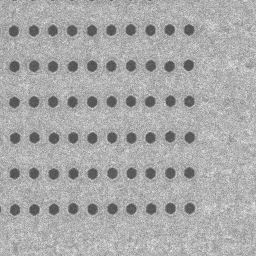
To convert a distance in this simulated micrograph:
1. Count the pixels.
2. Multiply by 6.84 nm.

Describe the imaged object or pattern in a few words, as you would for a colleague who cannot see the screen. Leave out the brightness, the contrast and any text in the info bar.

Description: a regular array of holes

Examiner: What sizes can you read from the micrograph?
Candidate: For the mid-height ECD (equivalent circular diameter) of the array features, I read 78.4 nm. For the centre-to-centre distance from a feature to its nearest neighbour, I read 19.2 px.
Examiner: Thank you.